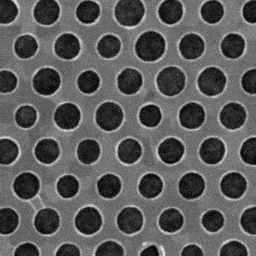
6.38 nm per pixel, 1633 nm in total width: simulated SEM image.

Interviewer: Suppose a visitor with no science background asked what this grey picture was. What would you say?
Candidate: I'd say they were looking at a regular array of holes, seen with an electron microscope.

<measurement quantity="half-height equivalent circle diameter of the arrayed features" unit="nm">170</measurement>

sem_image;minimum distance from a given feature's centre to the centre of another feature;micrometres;0.256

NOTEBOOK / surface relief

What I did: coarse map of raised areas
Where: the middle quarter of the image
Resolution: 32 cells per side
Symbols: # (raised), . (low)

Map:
###########################.####
######.########...######.....###
####....######.....#####......##
###......####.......###.......##
###......####.......###.......##
###......####......####.......##
####....######.....#####......##
#####..########...#######....###
################################
.#########...###################
...######.....######...#######..
....####.......####.....#####...
....####.......####......####...
....####.......####......####...
....####.......####.....#####...
...######.....######...#######..
..########...###################
################################
################.#########..####
####....######.....#####......##
###......####.......####......##
###......####.......###.......##
###......####.......###.......##
####.....#####.....#####......##
####....######....#######....###
################################
################################
##########..########...#######..
...######.....#####.....#####...
....####......#####......####...
....####.......####......###....
....####......#####......####...